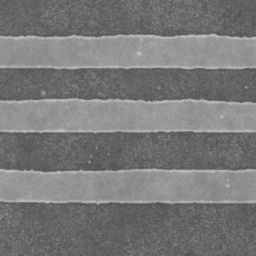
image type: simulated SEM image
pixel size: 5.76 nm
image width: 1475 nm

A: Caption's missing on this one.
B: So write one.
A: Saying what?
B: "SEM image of lines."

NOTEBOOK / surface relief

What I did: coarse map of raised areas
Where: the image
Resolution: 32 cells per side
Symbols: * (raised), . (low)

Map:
................................
................................
................................
................................
.........*....******...*****....
********************************
********************************
********************************
......****.....**......**.*****.
................................
................................
................................
.....********.*........**.......
********************************
********************************
********************************
................................
................................
................................
................................
................................
*****..*************************
********************************
********************************
********************************
................................
................................
................................
................................
................................
................................
................................